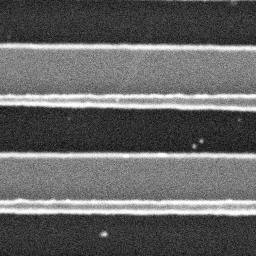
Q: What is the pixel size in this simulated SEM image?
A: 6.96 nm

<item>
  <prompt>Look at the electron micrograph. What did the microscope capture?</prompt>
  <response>lines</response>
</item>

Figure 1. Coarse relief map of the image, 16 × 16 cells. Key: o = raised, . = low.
................
................
................
oooooooooooooooo
oooooooooooooooo
oooooooooooooooo
oooooooooooooooo
................
................
................
oooooooooooooooo
oooooooooooooooo
oooooooooooooooo
................
................
................